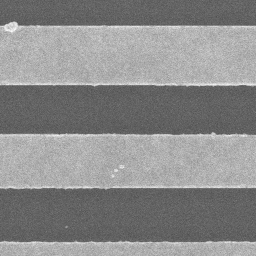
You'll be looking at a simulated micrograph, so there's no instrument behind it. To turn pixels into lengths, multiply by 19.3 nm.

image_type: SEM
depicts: lines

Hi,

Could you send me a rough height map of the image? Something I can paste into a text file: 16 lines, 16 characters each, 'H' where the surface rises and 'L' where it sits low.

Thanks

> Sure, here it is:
LLLLLLLLLLLLLLLL
HLLLLLLLLLLLLLLL
HHHHHHHHHHHHHHHH
HHHHHHHHHHHHHHHH
HHHHHHHHHHHHHHHH
LLLLLLLLLLLLLLLL
LLLLLLLLLLLLLLLL
LLLLLLLLLLLLLLLL
HHHHHHHHHHHHHHHH
HHHHHHHHHHHHHHHH
HHHHHHHHHHHHHHHH
HHHHHHHHHHHHHHHH
LLLLLLLLLLLLLLLL
LLLLLLLLLLLLLLLL
LLLLLLLLLLLLLLLL
HHHHHHHHHHHHHHHH